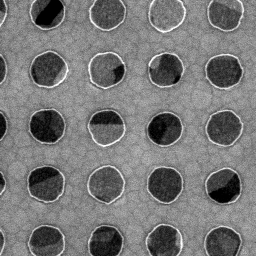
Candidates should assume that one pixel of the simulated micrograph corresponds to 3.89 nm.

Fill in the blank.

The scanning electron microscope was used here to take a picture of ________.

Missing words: a regular array of raised bodies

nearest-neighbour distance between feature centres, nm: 222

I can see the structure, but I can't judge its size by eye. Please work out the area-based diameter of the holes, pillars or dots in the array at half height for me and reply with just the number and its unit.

140 nanometres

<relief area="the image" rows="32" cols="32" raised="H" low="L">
HLLLHHHHLLLLHHHLLLLHHHHLLLHHHHLL
HLLLHHHHLLLHHHHHLLLHHHHLLLHHHHLL
HLLLHHHHLLLHHHHLLLLHHHHLLLHHHHLL
LLLLLHHLLLLLHHLLLLLHHHLLLLLHHLLL
LLLLLLLLLLLLLLLLLLLLLLLLLLLLLLLL
LLLLLLLLLLLLLLLLLLLLLLLLLLLLLLLL
LLLLLLHLLLLLLLLLLLLLLLLLLLLLLLLL
HLLLHHHHLLLHHHHLLLLHHHHLLLHHHHLL
HLLLHHHHLLLHHHHHLLLHHHHLLLHHHHLL
HLLLHHHHLLLHHHHLLLLHHHHLLLHHHHLL
LLLLLHHLLLLLHHHLLLLHHHLLLLLHHHLL
LLLLLLLLLLLLLLLLLLLLLLLLLLLLLLLL
LLLLLLLLLLLLLLLLLLLLLLLLLHLLLLLL
LLLLLLLLLLLLLLLLLLLLLLLLLLLLLLLL
HLLLHHHHLLLLHHHLLLLHHHLLLLHHHHLL
HLLLHHHHLLLHHHHHLLLHHHHLLLHHHHLL
HLLLHHHHLLLHHHHHLLHHHHHLLLHHHHLL
LLLLLHHLLLLLHHHLLLLHHHLLLLHHHHLL
LLLLLLLLLLLLLLLLLLLLLLLLLLLLLLLL
LLLLLLLLLLLLLLLLLLLLLLLLLLLLLLLL
LLLLLLLLLLLLLLLLLLLLLLLLLLLLLLLL
LLLLHHHLLLLLHHHLLLLHHHLLLLLHHLLL
HLLLHHHHLLLHHHHLLLHHHHHLLLHHHHLL
HLLLHHHHLLLHHHHLLLHHHHHLLLHHHHLL
LLLLHHHLLLLLHHHLLLLHHHLLLLHHHHLL
LLLLLLLLLLLLLLLLLLLLLLLLLLLLLLLL
LLLLLLLLLLLLLLLLLLLLLLLLLLLLLLLL
LLLLLLLLLLLLLLLLLLLLLLLLLLLLLLLL
LLLLLHHLLLLLHHLLLLLHHHLLLLLHHLLL
HLLLHHHHLLLHHHHLHLLHHHHLLLHHHHLL
HLLLHHHHLLLHHHHLLLHHHHHLLLHHHHLL
LLLLHHHHLLLHHHHLLLLHHHHLLLHHHHLL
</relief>